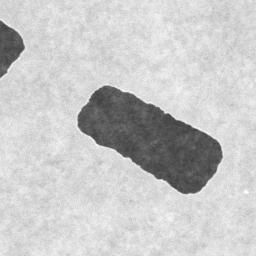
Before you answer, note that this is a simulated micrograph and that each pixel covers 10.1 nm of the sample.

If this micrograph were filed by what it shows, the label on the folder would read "holes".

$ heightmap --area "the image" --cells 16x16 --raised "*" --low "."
****************
****************
.***************
.***************
****************
******.*********
*****....*******
*****......*****
*****........***
*******.......**
*********.....**
**********...***
****************
****************
****************
****************